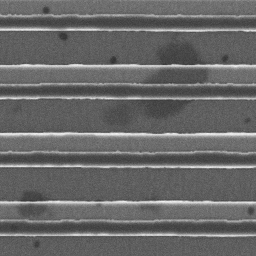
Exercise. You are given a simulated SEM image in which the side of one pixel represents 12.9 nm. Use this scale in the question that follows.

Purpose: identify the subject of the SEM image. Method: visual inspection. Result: lines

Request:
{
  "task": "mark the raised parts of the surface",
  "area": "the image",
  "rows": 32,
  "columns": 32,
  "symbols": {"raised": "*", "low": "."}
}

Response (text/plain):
********************************
********************************
********************************
********************************
................................
................................
................................
................................
********************************
********************************
********************************
********************************
................................
................................
................................
................................
................................
********************************
********************************
********************************
********************************
................................
................................
................................
................................
********************************
********************************
********************************
********************************
................................
................................
................................